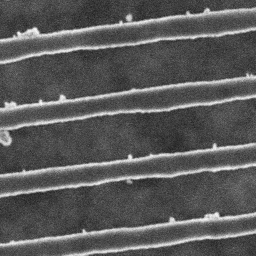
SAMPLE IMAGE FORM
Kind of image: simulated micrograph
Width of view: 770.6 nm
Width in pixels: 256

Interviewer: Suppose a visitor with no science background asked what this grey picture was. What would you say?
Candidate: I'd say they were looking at lines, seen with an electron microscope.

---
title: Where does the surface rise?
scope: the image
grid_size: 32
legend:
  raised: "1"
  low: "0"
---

00000000000000000000000000000000
00000000000000000000000000011111
00000000000000000001111111111111
00000000000111111111111111111111
00011111111111111111111111000000
11111111111111111100000000000000
11111111000000000000000000000000
11000000000000000000000000000000
00000000000000000000000000000000
00000000000000000000000000000000
00000000000000000000001111111111
00000000000000011111111111111111
00000000011111111111111111111100
01111111111111111111110000000000
11111111111100000000000000000000
11111000000000000000000000000000
10000000000000000000000000000000
10000000000000000000000000000000
00000000000000000000000000011111
00000000000000000001111111111111
00000000000111111111111111111111
00001111111111111111111110000000
11111111111111100000000000000000
11111111000000000000000000000000
00000000000000000000000000000000
00000000000000000000000000000000
00000000000000000000000000000000
00000000000000000000000011111111
00000000000000000011111111111111
00000000111111111111111111111100
01111111111111111111110000000000
11111111111110000000000000000000